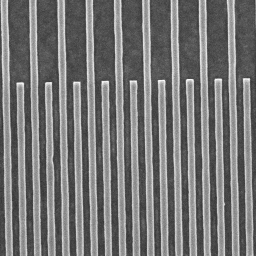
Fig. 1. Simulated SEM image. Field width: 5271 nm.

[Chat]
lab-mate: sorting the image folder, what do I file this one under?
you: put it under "parallel lines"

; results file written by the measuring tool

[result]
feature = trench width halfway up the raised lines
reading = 162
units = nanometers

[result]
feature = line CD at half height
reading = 144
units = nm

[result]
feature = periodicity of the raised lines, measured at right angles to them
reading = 291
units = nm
